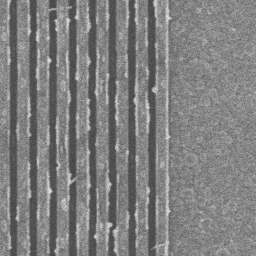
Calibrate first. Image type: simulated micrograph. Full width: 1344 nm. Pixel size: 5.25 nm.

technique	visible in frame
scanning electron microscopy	parallel lines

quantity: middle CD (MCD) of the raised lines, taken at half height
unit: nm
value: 66.2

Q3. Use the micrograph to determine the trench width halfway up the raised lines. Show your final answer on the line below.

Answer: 6.74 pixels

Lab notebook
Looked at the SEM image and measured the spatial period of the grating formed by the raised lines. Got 104 nanometers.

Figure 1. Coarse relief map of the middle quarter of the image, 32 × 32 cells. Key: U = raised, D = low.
UDDUUUDDUUUDDUUUDDUUUDDUUUDDDDDD
UDDUUUDDUUUDDUUUDDUUUDDUUUDDDDDD
UDDUUUDDUUUDDUUUDDUUUDDUUUDDDDDD
UDDUUUDDUUUDDUUUDDUUUDDUUUDDDDDD
UDDUUUDDUUUDDUUUDDUUUDDUUUDDDDDD
UDDUUUDDUUUDDUUUDDUUUDDUUUDDDDDD
UDDUUUDDUUUDDUUUDDUUUDUUUUDDDDDD
UUDUUUDDUUUDDUUUDDUUUDDUUUDDDDDD
UUDUUUDDUUUDDUUUDUUUUDDUUUDDDDDD
UUDUUUDDUUUDDUUUDUUUUDDUUUDDDDDD
UDDUUUDDUUUDDUUUDDUUUDDUUUDDDDDD
UDDUUUDDUUUDDUUUDDUUUDDUUUDDDDDD
UDDUUUDDUUUDDUUUDDUUUDDUUUDDDDDD
UDDUUUDDUUUDDUUUDDUUUDDUUUDDDDDD
UDDUUUDDUUUDDUUUDDUUUDDUUUDDDDDD
UDDUUUDDUUUDDUUUDDUUUDDUUUDDDDDD
UDDUUUDDUUUDDUUUDDUUUDDUUUDDDDDD
UDDUUUDDUUUDDUUUDDUUUDDUUUDDDDDD
UDDUUUDDUUUDDUUUDDUUUDDUUUDDDDDD
UDDUUUDDUUUDDUUUDDUUUDDUUUDDDDDD
UDDUUUDDUUUDDUUUDDUUUDDUUUDDDDDD
UDDUUUDDUUUDDUUUDDUUUDDUUUDDDDDD
UDDUUUDDUUUDDUUUDDUUUDDUUUDDDDDD
UDDUUUDDUUUDDUUUDDUUUDDUUUDDDDDD
UDDUUUDDUUUDDUUUDDUUUDDUUUDDDDDD
UDDUUUDDUUUDDUUUDDUUUDDUUUDDDDDD
UDDUUUDDUUUDDUUUDDUUUDDUUUDDDDDD
UUDUUUDDUUUDDUUUDDUUUDDUUUDDDDDD
UUDUUUDDUUUDDUUUDDUUUDDUUUDDDDDD
UUDUUUDDUUUDDUUUDDUUUDDUUUDDDDDD
UDDUUUUDUUUUDUUUDDUUUDDUUUDDDDDD
UDDUUUDDUUUDDUUUDDUUUDDUUUDDDDDD